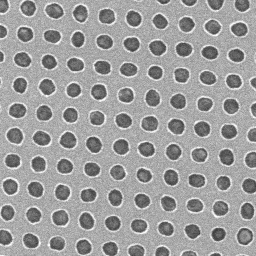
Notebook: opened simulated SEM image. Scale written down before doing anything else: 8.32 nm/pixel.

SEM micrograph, a regular array of holes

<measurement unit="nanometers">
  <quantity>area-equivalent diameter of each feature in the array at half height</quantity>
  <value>133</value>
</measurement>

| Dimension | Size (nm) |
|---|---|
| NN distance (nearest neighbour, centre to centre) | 211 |